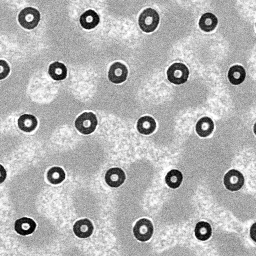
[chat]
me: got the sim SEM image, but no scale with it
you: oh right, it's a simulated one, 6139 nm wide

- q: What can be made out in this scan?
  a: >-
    a regular array of ring-shaped grooves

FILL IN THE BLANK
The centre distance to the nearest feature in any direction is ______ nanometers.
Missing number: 1420